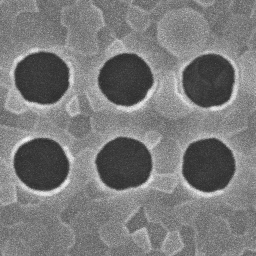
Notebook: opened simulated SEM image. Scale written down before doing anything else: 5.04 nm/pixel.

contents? holes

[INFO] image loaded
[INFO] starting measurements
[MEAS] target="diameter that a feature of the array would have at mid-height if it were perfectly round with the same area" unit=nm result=276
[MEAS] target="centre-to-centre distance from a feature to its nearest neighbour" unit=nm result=420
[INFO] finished